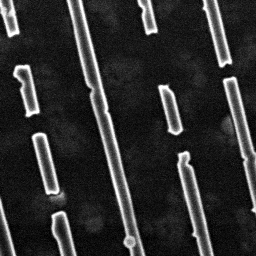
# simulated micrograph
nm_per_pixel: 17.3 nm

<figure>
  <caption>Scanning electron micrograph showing one or a few lines or trenches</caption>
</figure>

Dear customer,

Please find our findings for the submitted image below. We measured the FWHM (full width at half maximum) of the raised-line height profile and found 0.206 um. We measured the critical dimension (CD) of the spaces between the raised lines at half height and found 943 nm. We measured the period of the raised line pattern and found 1150 nanometres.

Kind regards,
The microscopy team